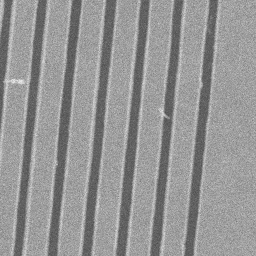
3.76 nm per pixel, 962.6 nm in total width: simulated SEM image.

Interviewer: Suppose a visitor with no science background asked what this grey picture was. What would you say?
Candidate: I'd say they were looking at parallel lines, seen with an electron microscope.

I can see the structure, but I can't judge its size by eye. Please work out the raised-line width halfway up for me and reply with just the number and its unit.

85.5 nm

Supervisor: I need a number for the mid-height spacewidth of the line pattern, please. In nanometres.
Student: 41.1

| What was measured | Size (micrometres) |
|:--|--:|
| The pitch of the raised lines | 0.128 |